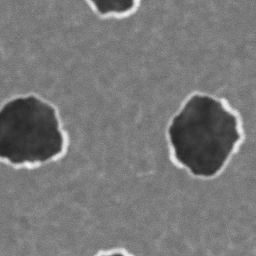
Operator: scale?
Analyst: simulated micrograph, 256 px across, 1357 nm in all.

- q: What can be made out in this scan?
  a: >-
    holes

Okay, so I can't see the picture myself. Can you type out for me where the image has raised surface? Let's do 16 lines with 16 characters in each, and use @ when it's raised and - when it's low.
@@@@@@--@@@@@@@@
@@@@@@@@@@@@@@@@
@@@@@@@@@@@@@@@@
@@@@@@@@@@@@@@@@
@@@@@@@@@@@@@@@@
@@@@@@@@@@@@@@@@
---@@@@@@@@@--@@
----@@@@@@@----@
----@@@@@@@----@
----@@@@@@@---@@
@@@@@@@@@@@@--@@
@@@@@@@@@@@@@@@@
@@@@@@@@@@@@@@@@
@@@@@@@@@@@@@@@@
@@@@@@@@@@@@@@@@
@@@@@@@@@@@@@@@@